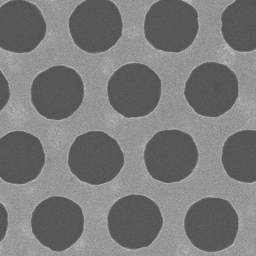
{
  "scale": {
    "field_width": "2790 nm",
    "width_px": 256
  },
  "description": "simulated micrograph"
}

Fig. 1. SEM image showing a regular array of holes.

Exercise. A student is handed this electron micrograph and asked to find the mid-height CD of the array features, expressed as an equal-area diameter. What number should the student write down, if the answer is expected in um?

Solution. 0.594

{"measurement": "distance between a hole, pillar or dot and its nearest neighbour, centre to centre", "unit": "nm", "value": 820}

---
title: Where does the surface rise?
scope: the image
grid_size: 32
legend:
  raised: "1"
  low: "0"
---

10001111110000111110000011111000
00000111100000011100000001110000
00000011100000011100000001110000
00000011100000011100000001110000
00000011100000011100000001110000
00000111100000111110000011110000
11001111111001111111100111111101
11111111111111111111111111111111
11111100011111100001111100000111
01111000001111000000111100000011
01110000001110000000111000000011
01110000000110000000111000000011
01110000001111000000111000000011
11110000001111000001111100000111
11111000011111100011111111011111
11111111111111111111111111111111
10011111111001111111000111111100
00000111100000111110000011110000
00000111100000011100000001110000
00000011100000011100000001110000
00000011100000011100000001110000
00000111100000011110000011110000
00001111110000111111000111111000
11111111111111111111111111111111
11111111111111110011111111111111
11111000001111000000111100000111
01110000001111000000111000000011
01110000001110000000111000000011
01110000001111000000111000000011
01110000001111000000111000000011
11111000011111100001111100000111
11111111111111111111111111111111